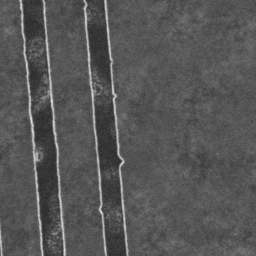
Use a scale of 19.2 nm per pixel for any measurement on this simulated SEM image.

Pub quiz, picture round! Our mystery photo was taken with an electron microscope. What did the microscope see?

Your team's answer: one or a few lines or trenches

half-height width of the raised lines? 422 nanometers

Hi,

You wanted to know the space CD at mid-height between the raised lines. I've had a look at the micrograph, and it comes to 769 nanometers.